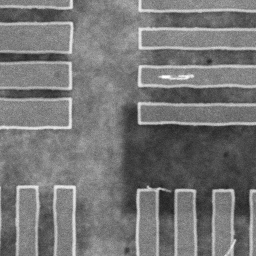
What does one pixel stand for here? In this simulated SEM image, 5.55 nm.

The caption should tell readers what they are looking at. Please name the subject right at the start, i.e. groups of lines, slits or small figures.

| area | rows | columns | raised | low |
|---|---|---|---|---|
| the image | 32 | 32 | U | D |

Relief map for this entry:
UUUUUUUUUDDDDDDDDUUUUUUUUUUUUUUU
DDDDDDDDDDDDDDDDDDDDDDDDDDDDDDDD
DDDDDDDDDDDDDDDDDDDDDDDDDDDDDDDD
UUUUUUUUUDDDDDDDDDDDDDDDDDDDDDDD
UUUUUUUUUDDDDDDDDUUUUUUUUUUUUUUU
UUUUUUUUUDDDDDDDDUUUUUUUUUUUUUUU
DDDUUUDUDDDDDDDDDDDDDDDDDDDDDDDD
DDDDDDDDDDDDDDDDDDDDDDDDDDDDDDDD
UUUUUUUUUDDDDDDDDDUUUUUUUUUUUUUU
UUUUUUUUUDDDDDDDDUUUUUUUUUUUUUUU
UUUUUUUUUDDDDDDDDDUUUUUUUUUUUUUU
DDDDDDDDDDDDDDDDDDDDDDDDDDDDDDDD
UUDUUUUUDDDDDDDDDDDDDDDDDDDDDDDD
UUUUUUUUUDDDDDDDDUUUUUUUUUUUUUUU
UUUUUUUUUDDDDDDDDUUUUUUUUUUUUUUU
UUUUUUUUUDDDDDDDDDDDDDDDDDUUDDDD
DDDDDDDDDDDDDDDDDDDDDDDDDDDDDDDD
DDDDDDDDDDDDDDDDDDDDDDDDDDDDDDDD
DDDDDDDDDDDDDDDDDDDDDDDDDDDDDDDD
DDDDDDDDDDDDDDDDDDDDDDDDDDDDDDDD
DDDDDDDDDDDDDDDDDDDDDDDDDDDDDDDD
DDDDDDDDDDDDDDDDDDDDDDDDDDDDDDDD
DDDDDDDDDDDDDDDDDDDDDDDDDDDDDDDD
DDDUDDDUUDDDDDDDDDDDDDDDDDDDDDDD
DDUUUDDUUDDDDDDDDUUUDDUUDDDUUDDU
DDUUUDDUUDDDDDDDDUUUDDUUDDDUUDDU
DDUUUDDUUDDDDDDDDUUUDDUUDDDUUDDD
DDUUUDDUUDDDDDDDDUUUDDUUDDDUUDDU
DDUUUDDUUDDDDDDDDUUUDDUUDDDUUDDU
DDUUUDDUUDDDDDDDDUUUDDUUDDDUUDDU
DDUUUDDUUDDDDDDDDUUUDDUUDDDUUDDU
DDUUUDDUUDDDDDDDDUUUDDUUDDDUUDDU